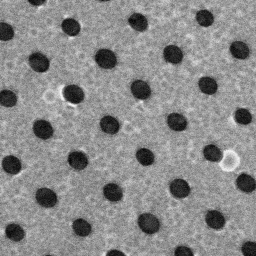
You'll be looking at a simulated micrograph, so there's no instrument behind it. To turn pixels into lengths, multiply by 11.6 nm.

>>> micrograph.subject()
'a regular array of raised bodies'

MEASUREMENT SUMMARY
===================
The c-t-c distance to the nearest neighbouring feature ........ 542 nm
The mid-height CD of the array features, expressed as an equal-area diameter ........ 241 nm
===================